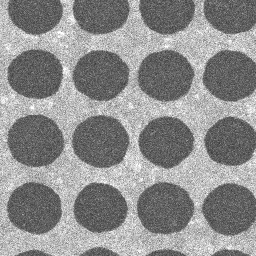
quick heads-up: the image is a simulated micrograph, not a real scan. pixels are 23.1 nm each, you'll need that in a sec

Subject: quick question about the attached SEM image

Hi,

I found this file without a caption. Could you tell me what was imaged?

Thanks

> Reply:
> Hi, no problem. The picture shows a regular array of holes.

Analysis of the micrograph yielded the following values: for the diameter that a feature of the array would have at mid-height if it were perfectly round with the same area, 1240 nm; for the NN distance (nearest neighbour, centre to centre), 1500 nm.